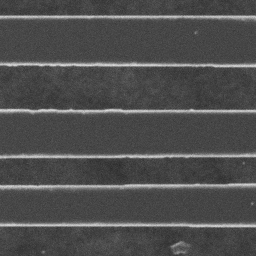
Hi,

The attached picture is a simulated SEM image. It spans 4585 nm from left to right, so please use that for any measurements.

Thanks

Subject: lines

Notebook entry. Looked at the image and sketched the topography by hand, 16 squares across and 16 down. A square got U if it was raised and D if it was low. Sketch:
DDDDDDDDDDDDDDDD
UUUUUUUUUUUUUUUU
UUUUUUUUUUUUUUUU
UUUUUUUUUUUUUUUU
DDDDDDDDDDDDDDDD
DDDDDDDDDDDDDDDD
DDDDDDDDDDDDDDDD
UUUUUUUUUUUUUUUU
UUUUUUUUUUUUUUUU
UUUUUUUUUUUUUUUU
DDDDDDDDDDDDDDDD
DDDDDDDDDDDDDDDD
UUUUUUUUUUUUUUUU
UUUUUUUUUUUUUUUU
DDDDDDDDDDDDDDDD
DDDDDDDDDDDDDDDD